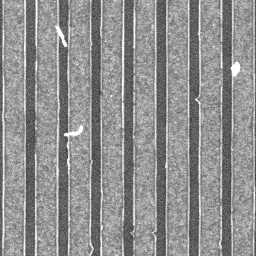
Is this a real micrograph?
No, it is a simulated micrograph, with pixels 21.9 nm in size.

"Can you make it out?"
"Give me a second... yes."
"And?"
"parallel lines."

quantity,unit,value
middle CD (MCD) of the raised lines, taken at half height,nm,473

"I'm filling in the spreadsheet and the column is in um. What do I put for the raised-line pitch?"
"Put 0.716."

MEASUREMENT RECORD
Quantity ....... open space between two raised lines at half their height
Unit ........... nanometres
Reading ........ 235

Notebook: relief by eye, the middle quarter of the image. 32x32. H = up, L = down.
LHHHHHHLLHHHHHHLLLHHHHHLLLHHHHHL
LHHHHHHLLHHHHHHLLLHHHHHLLLHHHHHL
LHHHHHHLLHHHHHHLLLHHHHHLLLHHHHHL
LHHHHHHLLHHHHHHLLLHHHHHLLLHHHHHL
LHHHHHHLLHHHHHHLLLHHHHHLLLHHHHHL
LHHHHHHLLHHHHHLLLLHHHHHLLLHHHHHL
LHHHHHHLLHHHHHLLLLHHHHHLLLHHHHHL
LHHHHHHLLHHHHHLLLLHHHHHLLLHHHHHL
LHHHHHHLLHHHHHLLLLHHHHHLLLHHHHHL
LHHHHHHLLHHHHHLLLLHHHHHLLLHHHHHL
LHHHHHHLLHHHHHHLLLHHHHHLLLHHHHHL
LHHHHHHLLHHHHHHLLLHHHHHLLLHHHHHL
LHHHHHHLLHHHHHHLLLHHHHHLLLHHHHHL
LHHHHHHLLHHHHHHLLLHHHHHLLLHHHHHL
LHHHHHHLLHHHHHHLLHHHHHHLLLHHHHHL
LHHHHHHLLLHHHHHLLHHHHHHLLLHHHHHL
LHHHHHHLLLHHHHHLLHHHHHHLLLHHHHHL
LHHHHHHLLLHHHHHLLHHHHHHLLLHHHHHL
LHHHHHHLLHHHHHHLLHHHHHHLLLHHHHHL
LHHHHHHLLHHHHHHLLLHHHHHLLLHHHHHL
LHHHHHHLLLHHHHHLLLHHHHHLLLHHHHHL
LHHHHHHLLLHHHHHLLLHHHHHLLLHHHHHL
LHHHHHHLLLHHHHHLLLHHHHHLLLHHHHHL
LHHHHHHLLLHHHHHLLLHHHHHLLLHHHHHL
LHHHHHHLLLHHHHHLLLHHHHHLLLHHHHHL
LHHHHHHLLLHHHHHLLLHHHHHLLLHHHHHL
LHHHHHHLLLHHHHHLLLHHHHHLLLHHHHHL
LHHHHHHLLLHHHHHLLLHHHHHLLLHHHHHL
LHHHHHHLLLHHHHHLLLHHHHHLLLHHHHHL
LHHHHHHLLLHHHHHLLLHHHHHLLLHHHHHL
LHHHHHHLLLHHHHHLLLHHHHHLLLHHHHHL
LHHHHHHLLLHHHHHLLLHHHHHLLLHHHHHL